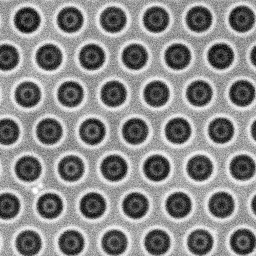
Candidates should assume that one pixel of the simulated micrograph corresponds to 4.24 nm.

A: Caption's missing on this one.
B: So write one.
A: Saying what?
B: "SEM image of an array of small figures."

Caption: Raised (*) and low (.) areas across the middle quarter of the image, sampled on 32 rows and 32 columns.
****......*****.....******.....*
*****...********...********...**
********************************
********************************
....******....*******....*******
.....****......*****......*****.
.**..****..**...****..**...***..
***..****..***..***...**...***..
***..****..**...****..**...***..
.....****......*****......*****.
....******....*******....*******
********************************
********************************
*****....*******...********...**
****......*****......*****.....*
****...*...***...**..****...*...
***...**...***..***...***..***..
***...**...***...**...***..***..
****......*****......****.......
****......*****.....******.....*
******..*********.**************
********************************
*..********...********..********
....******.....*****......*****.
.....****.......****.......****.
.**..****..***..***...***..***..
***..****..***..***...***..***..
.....****...*...****.......****.
....******.....*****......*****.
...********...********..********
********************************
********************************